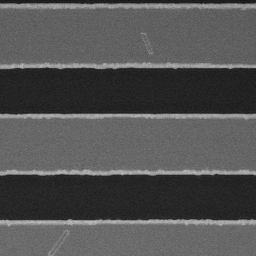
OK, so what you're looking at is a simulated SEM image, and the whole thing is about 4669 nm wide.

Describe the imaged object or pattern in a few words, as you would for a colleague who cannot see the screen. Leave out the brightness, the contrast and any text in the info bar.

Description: lines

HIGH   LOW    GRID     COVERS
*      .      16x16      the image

****************
****************
****************
****************
................
................
................
****************
****************
****************
****************
................
................
................
****************
****************